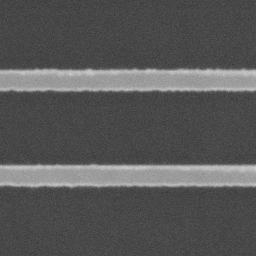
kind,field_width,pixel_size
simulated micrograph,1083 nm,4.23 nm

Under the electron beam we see lines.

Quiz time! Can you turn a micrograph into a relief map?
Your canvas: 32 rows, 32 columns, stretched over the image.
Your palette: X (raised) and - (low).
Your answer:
--------------------------------
--------------------------------
--------------------------------
--------------------------------
--------------------------------
--------------------------------
--------------------------------
--------------------------------
--------------------------------
XXXXXXXXXXXXXXXXXXXXXXXXXXXXXXXX
XXXXXXXXXXXXXXXXXXXXXXXXXXXXXXXX
--------------------------------
--------------------------------
--------------------------------
--------------------------------
--------------------------------
--------------------------------
--------------------------------
--------------------------------
--------------------------------
--------------------------------
XXXXXXXXXXXXXXXXXXXXXXXXXXXXXXXX
XXXXXXXXXXXXXXXXXXXXXXXXXXXXXXXX
--------------------------------
--------------------------------
--------------------------------
--------------------------------
--------------------------------
--------------------------------
--------------------------------
--------------------------------
--------------------------------